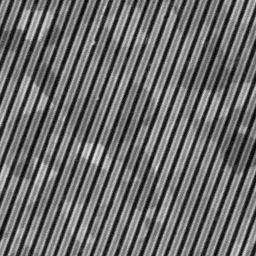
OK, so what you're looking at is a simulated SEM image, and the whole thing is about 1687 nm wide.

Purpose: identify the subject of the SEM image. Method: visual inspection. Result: parallel lines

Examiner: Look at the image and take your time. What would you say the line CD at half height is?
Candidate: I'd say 35.6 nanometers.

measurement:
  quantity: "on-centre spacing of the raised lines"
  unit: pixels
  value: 11.6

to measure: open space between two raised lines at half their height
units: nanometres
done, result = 40.2